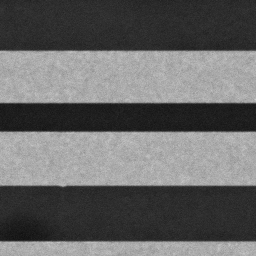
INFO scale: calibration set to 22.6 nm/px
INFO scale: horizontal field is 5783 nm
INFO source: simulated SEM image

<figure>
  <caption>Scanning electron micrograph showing lines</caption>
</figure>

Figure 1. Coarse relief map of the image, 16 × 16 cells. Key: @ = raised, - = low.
----------------
----------------
----------------
@@@@@@@@@@@@@@@@
@@@@@@@@@@@@@@@@
@@@@@@@@@@@@@@@@
----------------
----------------
@@@@@@@@@@@@@@@@
@@@@@@@@@@@@@@@@
@@@@@@@@@@@@@@@@
@@@@@@@@@@@@@@@@
----------------
----------------
----------------
@@@@@@@@@@@@@@@@